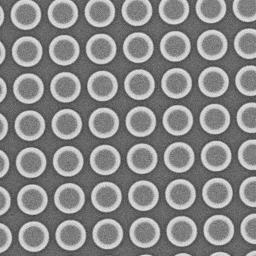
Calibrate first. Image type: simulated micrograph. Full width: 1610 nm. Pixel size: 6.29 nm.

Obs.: an array of small figures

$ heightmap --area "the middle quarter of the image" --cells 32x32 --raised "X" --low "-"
--------------------------------
-------------------X------XXXX--
XX-----XXXXX----XXXXXX---XXXXXX-
XXX---XXXXXXX--XXXXXXX---XXXXXXX
XXXX--XXXXXXX--XXXXXXXX-XXXXXXXX
XXXX--XXXXXXX--XXXXXXXX-XXXXXXXX
XXXX--XXXXXXX--XXXXXXX---XXXXXX-
XXXX---XXXXXX---XXXXXX---XXXXXX-
XXX----XXXXX-----XXXX------X----
--------------------------------
---------------------------XX---
XX------XXXX-----XXXXX----XXXXX-
XXX----XXXXXX---XXXXXX---XXXXXXX
XXXX--XXXXXXX---XXXXXXX--XXXXXXX
XXXX--XXXXXXXX--XXXXXXX--XXXXXXX
XXXX--XXXXXXXX--XXXXXXX--XXXXXXX
XXXX---XXXXXX---XXXXXX----XXXXX-
XXXX---XXXXXX----XXXX------XXX--
XX------------------------------
--------------------------------
---------XXX------XXX-----XXXXX-
XXX----XXXXXX---XXXXXXX---XXXXXX
XXXX---XXXXXXX--XXXXXXX--XXXXXXX
XXXXX--XXXXXXX--XXXXXXX--XXXXXXX
XXXXX--XXXXXXX--XXXXXXX--XXXXXXX
XXXXX--XXXXXXX--XXXXXXX---XXXXXX
XXXX----XXXXX----XXXXX-----XXXX-
XXX------XXX--------------------
--------------------------------
------------------XXX------XXXX-
XXX-----XXXXX----XXXXXX---XXXXXX
XXXX---XXXXXXX--XXXXXXX---XXXXXX